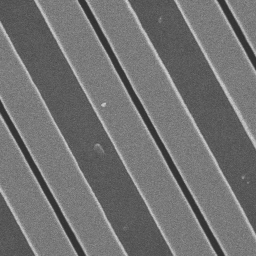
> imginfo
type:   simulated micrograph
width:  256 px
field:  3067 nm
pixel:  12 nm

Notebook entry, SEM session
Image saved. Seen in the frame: lines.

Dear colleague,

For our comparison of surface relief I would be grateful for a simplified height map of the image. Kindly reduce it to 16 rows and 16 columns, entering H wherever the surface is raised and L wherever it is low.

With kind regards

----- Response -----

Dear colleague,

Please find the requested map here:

LLHHHHHHLLLHHHHH
LLLHHHHHHLLLHHHH
HLLHHHHHHLLLHHHH
HLLLHHHHHHLLLHHH
HHLLLHHHHHLLLHHH
HHLLLHHHHHHLLLHH
HHHLLLHHHHHHLLHH
HHHLLLHHHHHHLLLH
HHHHLLLHHHHHHLLL
HHHHLLLHHHHHHLLL
HHHHHLLLHHHHHHLL
HHHHHHLLHHHHHHLL
HHHHHHLLLHHHHHHL
LHHHHHHLLHHHHHHL
LHHHHHHLLLHHHHHH
LLHHHHHHLLLHHHHH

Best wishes